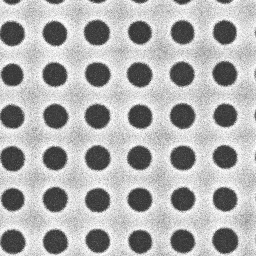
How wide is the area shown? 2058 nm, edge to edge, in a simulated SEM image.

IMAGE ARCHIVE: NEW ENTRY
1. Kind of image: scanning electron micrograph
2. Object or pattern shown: a regular array of holes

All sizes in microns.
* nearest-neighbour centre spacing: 0.334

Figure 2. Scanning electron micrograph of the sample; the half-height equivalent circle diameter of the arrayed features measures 208 nanometers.